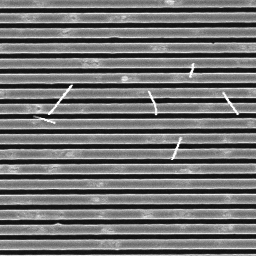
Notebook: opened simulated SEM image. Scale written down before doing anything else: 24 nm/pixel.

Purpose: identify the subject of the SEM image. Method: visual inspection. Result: parallel lines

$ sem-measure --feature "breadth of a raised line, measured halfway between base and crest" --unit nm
252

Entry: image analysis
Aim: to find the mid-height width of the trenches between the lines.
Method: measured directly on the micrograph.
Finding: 126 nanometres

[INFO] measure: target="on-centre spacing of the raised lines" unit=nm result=362